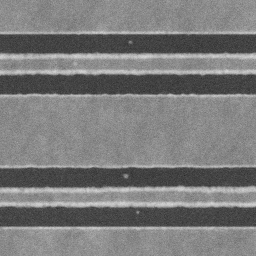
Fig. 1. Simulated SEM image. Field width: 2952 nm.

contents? lines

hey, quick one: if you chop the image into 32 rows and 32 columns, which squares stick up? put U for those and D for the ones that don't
UUUUUUUUUUUUUUUUUUUUUUUUUUUUUUUU
UUUUUUUUUUUUUUUUUUUUUUUUUUUUUUUU
UUUUUUUUUUUUUUUUUUUUUUUUUUUUUUUU
UUUUUUUUUUUUUUUUUUUUUUUUUUUUUUUU
DDDDDDDDDDDDDDDDDDDDDDDDDDDDDDDD
DDDDDDDDDDDDDDDDDDDDDDDDDDDDDDDD
DDDDDDDDDDDDDDDDDDDDDDDDDDDDDDDD
UUUUUUUUUUUUUUUUUUUUUUUUUUUUUUUU
UUUUUUUUUUUUUUUUUUUUUUUUUUUUUUUU
DDDDDDDDDDDDDDDDDDDDDDDDDDDDDDDD
DDDDDDDDDDDDDDDDDDDDDDDDDDDDDDDD
DDDDDDDDDDDDDDDDDDDDDDDDDDDDDDDD
UUUUUUUUUUUUUUUUUUUUUUUUUUUUUUUU
UUUUUUUUUUUUUUUUUUUUUUUUUUUUUUUU
UUUUUUUUUUUUUUUUUUUUUUUUUUUUUUUU
UUUUUUUUUUUUUUUUUUUUUUUUUUUUUUUU
UUUUUUUUUUUUUUUUUUUUUUUUUUUUUUUU
UUUUUUUUUUUUUUUUUUUUUUUUUUUUUUUU
UUUUUUUUUUUUUUUUUUUUUUUUUUUUUUUU
UUUUUUUUUUUUUUUUUUUUUUUUUUUUUUUU
UUUUUUUUUUUUUUUUUUUUUUUUUUUUUUUU
DDDDDDDDDDDDDDDDDDDDDDDDDDDDDDDD
DDDDDDDDDDDDDDDDDDDDDDDDDDDDDDDD
DDDDDDDDDDDDDDDDDDDDDDUDDDDDDDDD
UUUUUUUUUUUUUUUUUUUUUUUUUUUUUUUU
UUUUUUUUUUUUUUUUUUUUUUUUUUUUUUUU
DDDDDDDDDDDDDDDDDDDDDDDDDDDDDDDD
DDDDDDDDDDDDDDDDDDDDDDDDDDDDDDDD
UUUUUUUUUUUUUUUUUUUUUUUUUUUUUUUU
UUUUUUUUUUUUUUUUUUUUUUUUUUUUUUUU
UUUUUUUUUUUUUUUUUUUUUUUUUUUUUUUU
UUUUUUUUUUUUUUUUUUUUUUUUUUUUUUUU